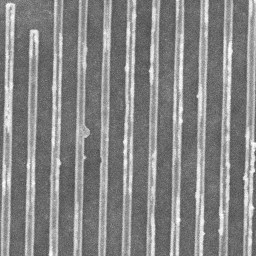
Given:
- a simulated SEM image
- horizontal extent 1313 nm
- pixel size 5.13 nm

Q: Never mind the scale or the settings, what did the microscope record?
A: parallel lines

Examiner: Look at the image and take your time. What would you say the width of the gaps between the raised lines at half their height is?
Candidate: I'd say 89.1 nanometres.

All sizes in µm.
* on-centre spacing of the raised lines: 0.124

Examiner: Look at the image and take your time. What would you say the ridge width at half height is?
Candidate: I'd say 6.8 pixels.